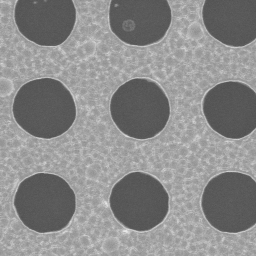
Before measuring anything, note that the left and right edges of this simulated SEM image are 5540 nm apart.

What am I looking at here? holes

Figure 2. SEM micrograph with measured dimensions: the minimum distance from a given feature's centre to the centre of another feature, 2.03 µm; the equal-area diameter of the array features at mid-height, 1310 nm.